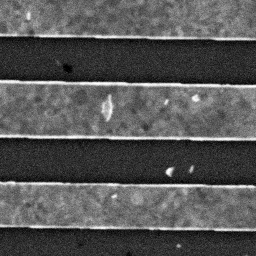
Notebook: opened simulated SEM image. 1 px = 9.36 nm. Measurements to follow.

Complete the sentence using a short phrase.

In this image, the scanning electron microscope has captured lines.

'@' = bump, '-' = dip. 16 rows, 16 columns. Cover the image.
@@@@@@@@@@@@@@@@
@@@@@@@@@@@@@@@@
----------------
----------------
----------------
@@@@@@@@@@@@@@@@
@@@@@@@@@@@@@@@@
@@@@@@@@@@@@@@@@
@@@@@@@@@@@@@@@@
----------------
----------------
@@@@@-----------
@@@@@@@@@@@@@@@@
@@@@@@@@@@@@@@@@
----------------
----------------